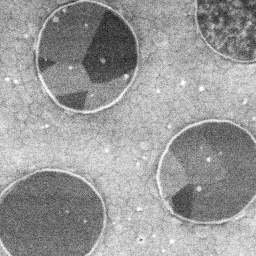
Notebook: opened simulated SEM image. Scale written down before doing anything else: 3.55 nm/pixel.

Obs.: raised bodies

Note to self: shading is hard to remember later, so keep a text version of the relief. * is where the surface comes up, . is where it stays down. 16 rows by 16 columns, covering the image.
....***.....****
...*****....****
..*******....***
..*******.......
..******........
...*****........
....***.........
................
...........*****
..........******
..........******
.*****....******
******....******
*******....****.
******..........
******..........